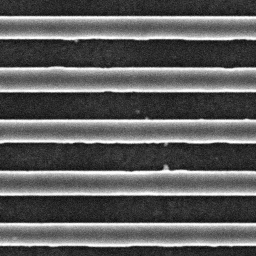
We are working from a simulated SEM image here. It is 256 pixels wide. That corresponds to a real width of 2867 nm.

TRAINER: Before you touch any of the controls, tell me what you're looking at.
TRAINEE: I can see lines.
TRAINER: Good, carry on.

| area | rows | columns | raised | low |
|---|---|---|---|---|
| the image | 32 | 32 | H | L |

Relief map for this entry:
LLLLLLLLLLLLLLLLLLLLLLLLLLLLLLLL
LLLLLLLLLLLLLLLLLLLLLLLLLLLLLLLL
HHHHHHHHHHHHHHHHHHHHHHHHHHHHHHHH
HHHHHHHHHHHHHHHHHHHHHHHHHHHHHHHH
HHHHHHHHHHHHHHHHHHHHHHHHHHHHHHHH
LLLLLLLLLLLLLLLLLLLLLLLLLLLLLLLL
LLLLLLLLLLLLLLLLLLLLLLLLLLLLLLLL
LLLLLLLLLLLLLLLLLLLLLLLLLLLLLLLL
LLLLLLLHLLLLLLLLLLLLLLLLLLLLLLLL
HHHHHHHHHHHHHHHHHHHHHHHHHHHHHHHH
HHHHHHHHHHHHHHHHHHHHHHHHHHHHHHHH
LLLLLLLLLLLLLLLLLLLLLLLLLLLLLLLL
LLLLLLLLLLLLLLLLLLLLLLLLLLLLLLLL
LLLLLLLLLLLLLLLLLLLLLLLLLLLLLLLL
LLLLLLLLLLLLLLLLLLLLLLLLLLLLLLLL
HHHHHHHHHHHHHHHHHHHHHHHHHHHHHHHH
HHHHHHHHHHHHHHHHHHHHHHHHHHHHHHHH
HHHHHHHHHHHHHHHHHHHHHHHHHHHHHHHH
LLLLLLLLLLLLLLLLLLLLLLLLLLLLLLLL
LLLLLLLLLLLLLLLLLLLLLLLLLLLLLLLL
LLLLLLLLLLLLLLLLLLLLLLLLLLLLLLLL
HLLLHHHHHHLHHLLLLLHHHHHHHHLLHHLL
HHHHHHHHHHHHHHHHHHHHHHHHHHHHHHHH
HHHHHHHHHHHHHHHHHHHHHHHHHHHHHHHH
LLLLLLLLLLLLLLLLLLLLLLLLLLLLLLLL
LLLLLLLLLLLLLLLLLLLLLLLLLLLLLLLL
LLLLLLLLLLLLLLLLLLLLLLLLLLLLLLLL
LLLLLLLLLLLLLLLLLLLLLLLLLLLLLLLL
HHHHHHHHHHHHHHHHHHHHHHHHHHHHHHHH
HHHHHHHHHHHHHHHHHHHHHHHHHHHHHHHH
HHHHHHHHHHHHHHHHHHHHHHHHHHHHHHHH
LLLLLLLLLLLLLLLLLLLLLLLLLLLLLLLL